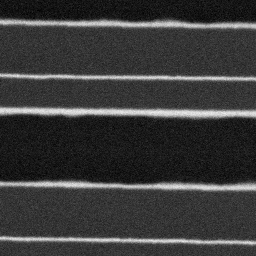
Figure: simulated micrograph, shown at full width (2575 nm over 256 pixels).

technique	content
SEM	lines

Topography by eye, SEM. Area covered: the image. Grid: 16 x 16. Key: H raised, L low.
LLLLLLLLLLLLLLLL
HHLLLLLLLLLLLLLL
HHHHHHHHHHHHHHHH
HHHHHHHHHHHHHHHH
HHHHHHHHHHHHHHHH
HHHHHHHHHHHHHHHH
HHHHHHHHHHHHHHHH
LLLLLLLLLLLLLLLL
LLLLLLLLLLLLLLLL
LLLLLLLLLLLLLLLL
LLLLLLLLLLLLLLLL
LLLLLLLLLLLLLLLL
HHHHHHHHHHHHHHHH
HHHHHHHHHHHHHHHH
HHHHHHHHHHHHHHHH
HHHHHHHHHHHHHHHH